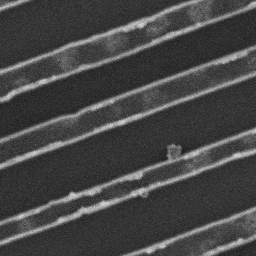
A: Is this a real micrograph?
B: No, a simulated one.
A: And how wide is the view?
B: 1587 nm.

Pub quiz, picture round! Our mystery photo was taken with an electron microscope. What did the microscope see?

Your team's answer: one or a few lines or trenches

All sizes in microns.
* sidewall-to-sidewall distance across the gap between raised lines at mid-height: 0.319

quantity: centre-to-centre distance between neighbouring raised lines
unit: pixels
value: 70.9